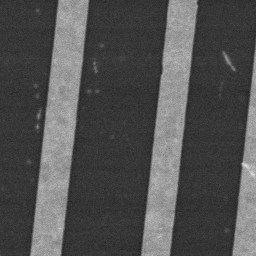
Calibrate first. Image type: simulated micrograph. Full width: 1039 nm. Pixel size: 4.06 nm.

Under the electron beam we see one or a few lines or trenches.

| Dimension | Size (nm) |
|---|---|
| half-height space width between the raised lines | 325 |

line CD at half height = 118 nanometers